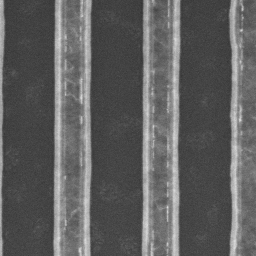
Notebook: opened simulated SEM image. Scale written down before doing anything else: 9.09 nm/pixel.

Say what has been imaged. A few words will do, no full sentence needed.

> one or a few lines or trenches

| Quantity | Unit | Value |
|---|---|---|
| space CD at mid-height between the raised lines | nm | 528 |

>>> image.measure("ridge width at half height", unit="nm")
273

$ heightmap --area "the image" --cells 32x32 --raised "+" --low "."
.......++++.......++++.......+++
.......++++.......++++.......+++
.......++++.......++++.......+++
.......++++.......++++.......+++
.......++++.......++++.......+++
.......++++.......++++.......+++
.......++++.......++++.......+++
.......++++.......++++.......+++
.......++++.......++++.......+++
.......++++.......++++.......+++
.......++++.......++++.......+++
.......++++.......++++.......+++
.......++++.......++++.......+++
.......++++.......++++.......+++
.......++++.......++++.......+++
.......++++.......++++.......+++
.......++++.......++++.......+++
.......++++.......++++.......+++
.......++++.......++++.......+++
.......++++.......++++.......+++
.......++++.......++++.......+++
.......++++.......++++.......+++
.......++++.......++++.......+++
.......++++.......++++.......+++
.......++++.......++++.......+++
.......++++.......++++.......+++
.......++++.......++++.......+++
.......++++.......++++.......+++
.......++++.......++++.......+++
.......++++.......++++.......+++
.......++++.......++++.......+++
.......++++.......++++.......+++